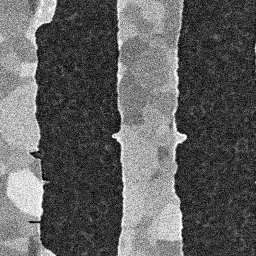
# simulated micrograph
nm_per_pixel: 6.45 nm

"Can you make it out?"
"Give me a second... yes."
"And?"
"one or a few lines or trenches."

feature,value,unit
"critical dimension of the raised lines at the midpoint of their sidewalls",379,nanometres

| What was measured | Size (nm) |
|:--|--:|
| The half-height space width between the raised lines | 524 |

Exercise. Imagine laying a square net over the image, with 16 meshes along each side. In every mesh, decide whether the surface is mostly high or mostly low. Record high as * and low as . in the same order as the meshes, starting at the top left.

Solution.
***....****.....
***....****.....
**.....****.....
**.....****.....
**.....****.....
**.....****.....
**.....****.....
**......***.....
**.....****.....
**......***.....
***.....***.....
***.....***.....
***.....***.....
**......***.....
**......***.....
***....****.....